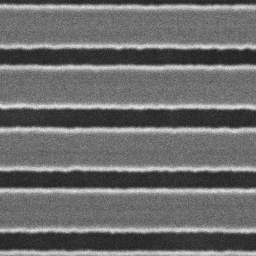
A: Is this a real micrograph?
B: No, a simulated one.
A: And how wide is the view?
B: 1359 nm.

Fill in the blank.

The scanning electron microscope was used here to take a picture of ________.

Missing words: lines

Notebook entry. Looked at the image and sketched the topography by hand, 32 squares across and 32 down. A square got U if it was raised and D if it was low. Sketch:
DDDDDDDDDDDDDDDDDDDDDDDDDDDDDDDD
UUUUUUUUUUUUUUUUUUUUUUUUUUUUUUUU
UUUUUUUUUUUUUUUUUUUUUUUUUUUUUUUU
UUUUUUUUUUUUUUUUUUUUUUUUUUUUUUUU
UUUUUUUUUUUUUUUUUUUUUUUUUUUUUUUU
UUUUUUUUUUUUUUUUUUUUUUUUUUUUUUUU
DDDDDDDDDDDDDDDDDDDDDDDDDDDDDDDD
DDDDDDDDDDDDDDDDDDDDDDDDDDDDDDDD
UUUUUUUUUUUUUUUUUUUUUUUUUUUUUUUU
UUUUUUUUUUUUUUUUUUUUUUUUUUUUUUUU
UUUUUUUUUUUUUUUUUUUUUUUUUUUUUUUU
UUUUUUUUUUUUUUUUUUUUUUUUUUUUUUUU
UUUUUUUUUUUUUUUUUUUUUUUUUUUUUUUU
UDDDUDUDDUUUUUUUUUUUUUUUUUUUUUUU
DDDDDDDDDDDDDDDDDDDDDDDDDDDDDDDD
DDDDDDDDDDDDDDDDDDDDDDDDDDDDDDDD
UUUUUUUUUUUUUUUUUUUUUUUUUUUUUUUU
UUUUUUUUUUUUUUUUUUUUUUUUUUUUUUUU
UUUUUUUUUUUUUUUUUUUUUUUUUUUUUUUU
UUUUUUUUUUUUUUUUUUUUUUUUUUUUUUUU
UUUUUUUUUUUUUUUUUUUUUUUUUUUUUUUU
DDDDDDDDDDDDDDDDDDDDDDDDDDDDDDDD
DDDDDDDDDDDDDDDDDDDDDDDDDDDDDDDD
DDDDDDDDDDDDDDDDDDDDDDDDDDDDDDDD
UUUUUUUUUUUUUUUUUUUUUUUUUUUUUUUU
UUUUUUUUUUUUUUUUUUUUUUUUUUUUUUUU
UUUUUUUUUUUUUUUUUUUUUUUUUUUUUUUU
UUUUUUUUUUUUUUUUUUUUUUUUUUUUUUUU
UUUUUUUUUUUUUUUUUUUUUUUUUUUUUUUU
DDDDDDDDDDDDDDDDDDDDDDDDDDDDDDDD
DDDDDDDDDDDDDDDDDDDDDDDDDDDDDDDD
UUUUUUUUUUUUUUUUUUUUUUUUUUUUUUUU